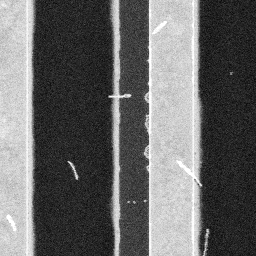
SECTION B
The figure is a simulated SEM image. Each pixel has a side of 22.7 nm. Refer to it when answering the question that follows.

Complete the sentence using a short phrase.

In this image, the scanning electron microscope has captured lines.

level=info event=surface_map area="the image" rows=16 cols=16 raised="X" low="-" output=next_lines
XX-----XXXXX----
XX-----XXXXX----
XX-----XXXXX----
XX-----XXXXX----
XX-----XXXXX----
XX-----XXXXX----
XX-----XXXXX----
XX-----XXXXX----
XX-----XXXXX----
XX-----XXXXX----
XX-----XXXXX----
XX-----XXXXX----
XX-----XXXXX----
XX-----XXXXX----
XX-----XXXXX----
XX-----XXXXX----